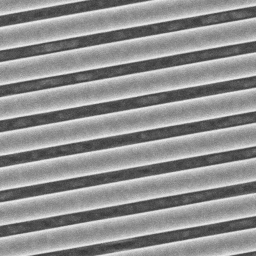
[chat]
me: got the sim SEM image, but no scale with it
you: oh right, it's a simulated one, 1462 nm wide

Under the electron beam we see parallel lines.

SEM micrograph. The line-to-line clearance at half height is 0.071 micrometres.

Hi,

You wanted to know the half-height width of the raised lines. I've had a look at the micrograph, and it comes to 128 nm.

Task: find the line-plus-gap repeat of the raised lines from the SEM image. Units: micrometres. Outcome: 0.197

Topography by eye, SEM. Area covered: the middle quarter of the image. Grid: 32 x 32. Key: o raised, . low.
oooooooooooo..................oo
oooooo..................oooooooo
o.................oooooooooooooo
............oooooooooooooooooooo
.......ooooooooooooooooooooooooo
.ooooooooooooooooooooooooooooooo
ooooooooooooooooooooooooooo.....
ooooooooooooooooooooo...........
oooooooooooooooo................
oooooooooo.................ooooo
oooo..................oooooooooo
.................ooooooooooooooo
............oooooooooooooooooooo
.....ooooooooooooooooooooooooooo
oooooooooooooooooooooooooooooooo
oooooooooooooooooooooooooo......
ooooooooooooooooooooo...........
ooooooooooooooo.................
ooooooooo..................ooooo
ooo..................ooooooooooo
...............ooooooooooooooooo
.........ooooooooooooooooooooooo
....oooooooooooooooooooooooooooo
oooooooooooooooooooooooooooooo..
oooooooooooooooooooooooo........
oooooooooooooooooo..............
ooooooooooooo.................o.
ooooooo...................oooooo
o..................ooooooooooooo
..............oooooooooooooooooo
.........ooooooooooooooooooooooo
...ooooooooooooooooooooooooooooo